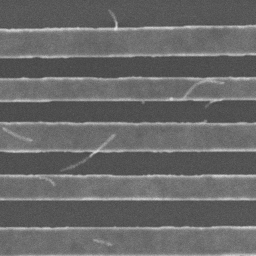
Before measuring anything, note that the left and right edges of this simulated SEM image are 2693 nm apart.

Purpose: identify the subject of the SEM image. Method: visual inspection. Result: lines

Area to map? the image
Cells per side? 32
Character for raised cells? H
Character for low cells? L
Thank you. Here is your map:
LLLLLLLLLLLLLLLLLLLLLLLLLLLLLLLL
LLLLLLLLLLLLLLLLLLLLLLLLLLLLLLLL
LLLLLLLLLLLLLLLLLLLLLLLLLLLLLLLL
LLLLLLLLLLLLLLHLLLHHHHHHHHHHHHHH
HHHHHHHHHHHHHHHHHHHHHHHHHHHHHHHH
HHHHHHHHHHHHHHHHHHHHHHHHHHHHHHHH
HHHHHHHHHHHHHHHHHHHHHHHHHHHHHHHH
LLLLLLLLLLLLLLLLLLLLLLLLLLLLLLLL
LLLLLLLLLLLLLLLLLLLLLLLLLLLLLLLL
LLLLLLLLLLLLLLLLLLLLLLLLLLLLLLLL
HHHHHHHHHHHHHHHHHHHHHHHHHHHHHHHH
HHHHHHHHHHHHHHHHHHHHHHHHHHHHHHHH
HHHHHHHHHHHHHHHHHHHHHHHHHHHHLLLL
LLLLLLLLLLLLLLLLLLLLLLLLLLLLLLLL
LLLLLLLLLLLLLLLLLLLLLLLLLLLLLLLL
HHHHHHHHHHHHHHHHHHHHHHHHHHHHHHHH
HHHHHHHHHHHHHHHHHHHHHHHHHHHHHHHH
HHHHHHHHHHHHHHHHHHHHHHHHHHHHHHHH
HHHHHHHHHHHHHHHHHHHHHHHHHHHHHHHH
LLLLLLLLLLLLLLLLLLLLLLLLLLLLLLLL
LLLLLLLLLLLLLLLLLLLLLLLLLLLLLLLL
LLLLLLLLLLLLLLLLLLLLLLLLLLLLLLLL
HHHHHHHHHHHHHHHHHHHHHHHHHHHHHHHH
HHHHHHHHHHHHHHHHHHHHHHHHHHHHHHHH
HHHHHHHHHHHHHHHHHHHHHHHHHHHHHHHH
LLLLLLLLLLLLLLLLLLLLLLLLLLLLLLLL
LLLLLLLLLLLLLLLLLLLLLLLLLLLLLLLL
LLLLLLLLLLLLLLLLLLLLLLLLLLLLLLLL
HHHHHHHHHHHHHHHHHHHHHHHHHHHHHHHH
HHHHHHHHHHHHHHHHHHHHHHHHHHHHHHHH
HHHHHHHHHHHHHHHHHHHHHHHHHHHHHHHH
HHHHHHHHHHHHHHHHHHHHHHHHHHHHHHHH